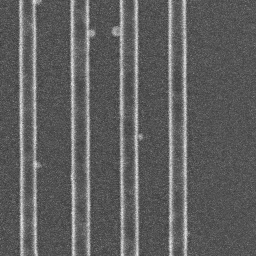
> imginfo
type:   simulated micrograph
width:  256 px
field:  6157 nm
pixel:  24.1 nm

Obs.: parallel lines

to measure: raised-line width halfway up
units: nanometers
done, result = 385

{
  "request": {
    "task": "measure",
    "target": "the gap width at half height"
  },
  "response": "794 nm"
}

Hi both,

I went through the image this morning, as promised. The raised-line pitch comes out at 1200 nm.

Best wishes